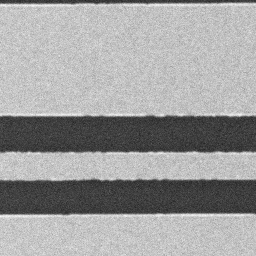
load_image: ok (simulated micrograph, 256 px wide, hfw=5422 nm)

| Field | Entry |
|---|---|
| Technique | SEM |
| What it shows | lines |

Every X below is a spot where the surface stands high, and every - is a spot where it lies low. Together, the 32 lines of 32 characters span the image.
--------------------------------
XXXXXXXXXXXXXXXXXXXXXXXXXXXXXXXX
XXXXXXXXXXXXXXXXXXXXXXXXXXXXXXXX
XXXXXXXXXXXXXXXXXXXXXXXXXXXXXXXX
XXXXXXXXXXXXXXXXXXXXXXXXXXXXXXXX
XXXXXXXXXXXXXXXXXXXXXXXXXXXXXXXX
XXXXXXXXXXXXXXXXXXXXXXXXXXXXXXXX
XXXXXXXXXXXXXXXXXXXXXXXXXXXXXXXX
XXXXXXXXXXXXXXXXXXXXXXXXXXXXXXXX
XXXXXXXXXXXXXXXXXXXXXXXXXXXXXXXX
XXXXXXXXXXXXXXXXXXXXXXXXXXXXXXXX
XXXXXXXXXXXXXXXXXXXXXXXXXXXXXXXX
XXXXXXXXXXXXXXXXXXXXXXXXXXXXXXXX
XXXXXXXXXXXXXXXXXXXXXXXXXXXXXXXX
--------------------------------
--------------------------------
--------------------------------
--------------------------------
--------------------------------
XXXXXXXXXXXXXXXXXXXXXXXXXXXXXXXX
XXXXXXXXXXXXXXXXXXXXXXXXXXXXXXXX
XXXXXXXXXXXXXXXXXXXXXXXXXXXXXXXX
--------------------------------
--------------------------------
--------------------------------
--------------------------------
--------------------------------
XXXXXXXXXXXXXXXXXXXXXXXXXXXXXXXX
XXXXXXXXXXXXXXXXXXXXXXXXXXXXXXXX
XXXXXXXXXXXXXXXXXXXXXXXXXXXXXXXX
XXXXXXXXXXXXXXXXXXXXXXXXXXXXXXXX
XXXXXXXXXXXXXXXXXXXXXXXXXXXXXXXX